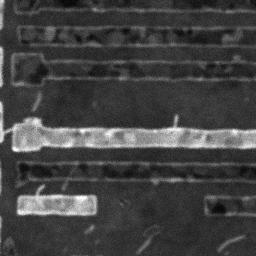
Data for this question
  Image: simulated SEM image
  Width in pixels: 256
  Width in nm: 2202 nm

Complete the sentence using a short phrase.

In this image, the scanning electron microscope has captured wiring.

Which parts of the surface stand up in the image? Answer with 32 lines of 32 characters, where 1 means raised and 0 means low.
00111111111111111111111111111111
00111000000000000000000000000001
00000000000000000000000000000000
00111111111111111111110010001111
00111111111111111111111111111111
00011111111111111111111111111111
00000000000000000000000000000000
00111100000000000000000000000000
00111111111111111111111111111111
00111111111111111111111111111111
00111000000000000000000000000000
00000000000000000000000000000000
00000000000000000000000000000000
00000000000000000000000000000000
00000000000000000000000000000000
00011000000000000000000000000000
00111111111111111111111111111111
00111111111111111111111111111111
00111000000000000000000000000000
00000000000000000000000000000000
00111111111111111111011110000000
00111111111111111111111111111111
00110100100011111111111111111111
00000000000000000000000000000000
00001000000000000000000000000000
00111111111100010000000000111111
00111111111100000000000000111111
00000000000000000000000000000000
00000000000000000001000000000000
00000000000000000000000000000000
01000000000000000000000000000000
01000000000000000000000000000000